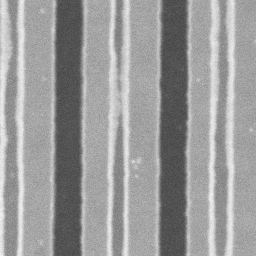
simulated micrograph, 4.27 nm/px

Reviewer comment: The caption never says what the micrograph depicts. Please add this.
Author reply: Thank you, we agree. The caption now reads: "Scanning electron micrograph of lines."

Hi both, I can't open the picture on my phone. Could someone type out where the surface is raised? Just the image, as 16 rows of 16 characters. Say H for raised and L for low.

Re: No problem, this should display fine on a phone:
HHHLLHHHHHLLHHHH
HHHLLHHHHHLLHHHH
HHHLLHHHHHLLHHHH
HHHLLHHHHHLLHHHH
HHHLLHHHHHLLHHHH
HHHLLHHHHHLLHHHH
HHHLLHHHHHLLHHHH
HHHLLHHHHHLLHHHH
HHHLLHHHHHLLHHHH
HHHLLHHHHHLLHHHH
HHHLLHHHHHLLHHHH
HHHLLHHHHHLLHHHH
HHHLLHHHHHLLHHHH
HHHLLHHHHHLLHHHH
HHHLLHHHHHLLHHHH
HHHLLHHHHHLLHHHH